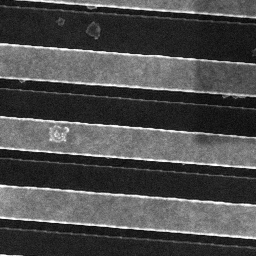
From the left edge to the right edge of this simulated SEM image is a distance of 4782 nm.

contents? lines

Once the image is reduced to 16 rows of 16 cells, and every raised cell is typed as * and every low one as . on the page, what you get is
.......*********
................
................
**********......
****************
.........*******
................
***.............
***************.
..**************
...............*
................
************....
****************
..........******
................